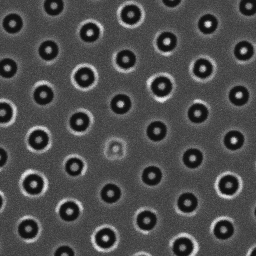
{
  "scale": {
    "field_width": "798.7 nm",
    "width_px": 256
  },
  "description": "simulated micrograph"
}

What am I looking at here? a regular array of ring-shaped grooves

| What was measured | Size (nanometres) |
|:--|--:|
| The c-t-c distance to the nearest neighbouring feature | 140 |